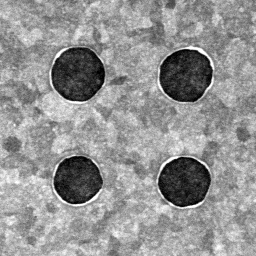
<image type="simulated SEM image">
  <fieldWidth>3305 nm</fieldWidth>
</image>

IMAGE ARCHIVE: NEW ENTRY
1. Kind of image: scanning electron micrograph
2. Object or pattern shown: holes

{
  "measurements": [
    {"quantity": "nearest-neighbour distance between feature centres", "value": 1370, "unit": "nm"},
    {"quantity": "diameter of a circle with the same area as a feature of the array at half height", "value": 687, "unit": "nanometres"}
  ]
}